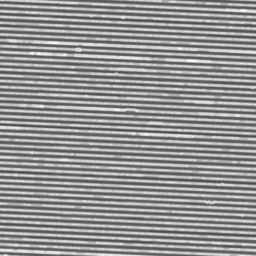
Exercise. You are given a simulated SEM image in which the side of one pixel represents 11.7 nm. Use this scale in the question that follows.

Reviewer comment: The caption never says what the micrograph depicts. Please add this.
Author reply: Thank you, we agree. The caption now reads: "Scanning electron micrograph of parallel lines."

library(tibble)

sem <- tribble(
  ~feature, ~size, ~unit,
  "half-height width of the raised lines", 0.0306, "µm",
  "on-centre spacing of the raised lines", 67.9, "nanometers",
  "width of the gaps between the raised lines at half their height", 40.8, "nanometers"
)